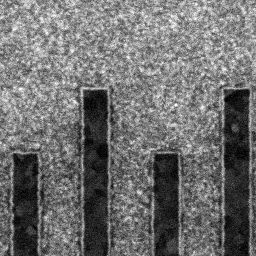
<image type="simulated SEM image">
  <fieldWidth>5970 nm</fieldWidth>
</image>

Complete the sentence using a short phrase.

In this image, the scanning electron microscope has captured one or a few lines or trenches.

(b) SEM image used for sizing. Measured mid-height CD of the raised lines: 0.644 microns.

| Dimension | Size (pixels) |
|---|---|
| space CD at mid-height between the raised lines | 42.9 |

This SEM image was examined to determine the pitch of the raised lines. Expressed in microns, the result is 1.64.